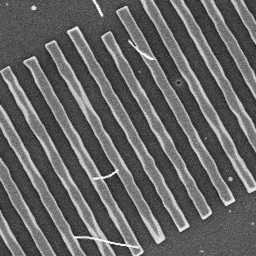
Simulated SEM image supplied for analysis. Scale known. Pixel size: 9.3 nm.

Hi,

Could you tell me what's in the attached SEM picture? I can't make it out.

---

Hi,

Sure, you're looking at groups of lines, slits or small figures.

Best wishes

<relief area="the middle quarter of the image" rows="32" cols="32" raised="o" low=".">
o.....ooo....ooo.....ooo....ooo.
oo....oooo....ooo.....ooo....ooo
oo.....ooo....ooo.....ooo....ooo
ooo.....oo.....ooo....oooo....oo
.ooo....ooo.....ooo....ooo.....o
.ooo.....ooo....ooo.....ooo....o
..ooo....ooo.....oo.....oooo....
..ooo.....ooo....ooo.....ooo....
...oo.....ooo.....ooo....oooo...
....oo.....ooo.....ooo....ooo...
....ooo....oooo....ooo.....ooo..
.....oo.....ooo....ooo.....ooo..
o....ooo.....ooo....ooo.....ooo.
o.....ooo....ooo.....ooo....ooo.
o.....ooo.....ooo....ooo.....ooo
oo.....ooo....ooo.....ooo....ooo
oo.....ooo.....ooo....ooo.....oo
ooo.....ooo.....ooo....ooo.....o
.ooo....ooo.....ooo.....ooo....o
..oo.....ooo....ooo.....ooo....o
..ooo.....oo.....ooo.....ooo....
...oo.....ooo.....ooo....ooo....
...ooo....ooo.....ooo....oooo...
....ooo....ooo.....ooo....ooo...
....ooo.....ooo....ooo.....ooo..
.....ooo....ooo.....ooo.....oo..
o.....oo.....ooo....oooo....ooo.
o.....ooo....oooo....ooo.....oo.
oo.....ooo....ooo.....ooo....ooo
oo.....ooo.....ooo....ooo.....oo
ooo.....ooo....ooo.....oo.....oo
.ooo....ooo.....ooo....ooo.....o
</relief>